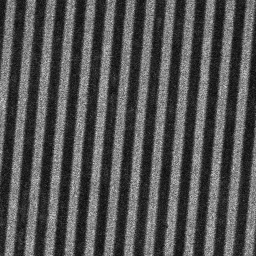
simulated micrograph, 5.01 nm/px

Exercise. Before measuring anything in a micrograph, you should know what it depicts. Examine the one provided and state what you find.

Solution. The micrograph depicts parallel lines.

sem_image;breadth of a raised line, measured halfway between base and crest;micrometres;0.043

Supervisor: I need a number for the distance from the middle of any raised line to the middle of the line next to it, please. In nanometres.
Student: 99.6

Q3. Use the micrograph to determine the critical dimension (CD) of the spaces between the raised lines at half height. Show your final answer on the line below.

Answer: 0.0561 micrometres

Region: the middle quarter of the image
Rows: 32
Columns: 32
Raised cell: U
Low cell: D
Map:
UDDDUUDDDUUDDDUUDDDUUDDDUUDDDUUD
UDDDUUDDDUUDDDUUDDDUUDDDUUDDDUUD
UDDDUUDDDUUDDDUUDDDUUDDDUUDDDUUD
UDDDUUDDDUUDDDUUDDDUUDDDUUDDDUUD
UDDDUUDDDUUDDDUUDDDUUDDDUUDDDUUD
UDDDUUDDDUUDDDUUDDDUUDDDUUDDDUUD
UDDDUUDDDUUDDDUUDDDUUDDDUUDDDUUD
UDDDUUDDDUUDDDUUDDDUUDDDUUDDDUUD
UDDDUUDDDUUDDDUUDDDUUDDDUUDDDUUD
UDDDUUDDDUUDDDUUDDDUUDDDUUDDDUUD
DDDDUDDDDUUDDDUDDDUUDDDUUDDDUUDD
DDDUUDDDUUDDDUUDDDUUDDDUUDDDUUDD
DDDUUDDDUUDDDUUDDDUUDDDUUDDDUUDD
DDDUUDDDUUDDDUUDDDUUDDDUUDDDUUDD
DDDUUDDDUUDDDUUDDDUUDDDUUDDDUUDD
DDDUUDDDUUDDDUUDDDUUDDDUUDDDUUDD
DDDUUDDDUUDDDUUDDDUUDDDUUDDDUUDD
DDDUUDDDUUDDDUUDDDUUDDDUUDDDUUDD
DDDUUDDDUUDDDUUDDDUUDDDUUDDDUUDD
DDDUUDDDUUDDDUUDDDUUDDDUUDDDUUDD
DDDUDDDDUUDDDUUDDDUUDDDUUDDDUUDD
DDDUDDDDUUDDDUDDDDUDDDUUDDDUUDDD
DDUUDDDUUDDDUUDDDUUDDDUUDDDUUDDD
DDUUDDDUUDDDUUDDDUUDDDUUDDDUUDDD
DDUUDDDUUDDDUUDDDUUDDDUUDDDUUDDD
DDUUDDDUUDDDUUDDDUUDDDUUDDDUUDDD
DDUUDDDUUDDDUUDDDUUDDDUUDDDUUDDD
DDUUDDDUUDDDUUDDDUUDDDUUDDDUUDDD
DDUUDDDUUDDDUUDDDUUDDDUUDDDUUDDD
DDUUDDDUUDDDUUDDDUUDDDUUDDDUUDDD
DDUUDDDUUDDDUUDDDUUDDDUUDDDUUDDD
DDUUDDDUUDDDUUDDDUDDDDUUDDDUUDDD